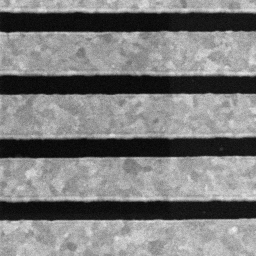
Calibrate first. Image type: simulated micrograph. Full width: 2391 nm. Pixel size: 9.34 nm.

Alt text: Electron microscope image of lines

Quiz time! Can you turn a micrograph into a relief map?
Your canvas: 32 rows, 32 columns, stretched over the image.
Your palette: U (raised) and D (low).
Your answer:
UUUUUUUUUUUUUUUUUUUUUUUUUUUUUUUU
DDDDDDDDDDDUDDDDDDUUDDDDDDUDDDDU
DDDDDDDDDDDDDDDDDDDDDDDDDDDDDDDD
DDDDDDDDDDDDDDDDDDDDDDDDDDDDDDDD
UUUUUUUUUUUUUUUUUUUUUUUUUUUUUUUU
UUUUUUUUUUUUUUUUUUUUUUUUUUUUUUUU
UUUUUUUUUUUUUUUUUUUUUUUUUUUUUUUU
UUUUUUUUUUUUUUUUUUUUUUUUUUUUUUUU
UUUUUUUUUUUUUUUUUUUUUUUUUUUUUUUU
DDDDDDDDDDDDDDDDDDDDDDDDDDDDDDDD
DDDDDDDDDDDDDDDDDDDDDDDDDDDDDDDD
DDDDDDDDDDDDDDDDDDDDDDDDDDDDDDDD
UUUUUUUUUUUUUUUUUUUUUUUUUUUUUUUU
UUUUUUUUUUUUUUUUUUUUUUUUUUUUUUUU
UUUUUUUUUUUUUUUUUUUUUUUUUUUUUUUU
UUUUUUUUUUUUUUUUUUUUUUUUUUUUUUUU
UUUUUUUUUUUUUUUUUUUUUUUUUUUUUUUU
DDDDDDDDDDDDDDDDDDDDDDDDDDDDDDDD
DDDDDDDDDDDDDDDDDDDDDDDDDDDDDDDD
DDDDDDDDDDDDDDDDDDDDDDDDDDDDDDDD
UUUUUUUUUUUUUUUUUUUUUUUUUUUUUUUU
UUUUUUUUUUUUUUUUUUUUUUUUUUUUUUUU
UUUUUUUUUUUUUUUUUUUUUUUUUUUUUUUU
UUUUUUUUUUUUUUUUUUUUUUUUUUUUUUUU
UUUUUUUUUUUUUUUUUUUUUUUUUUUUUUUU
DDDDDDDDDDDDDDDDDDDDDDDDDDDDDDDD
DDDDDDDDDDDDDDDDDDDDDDDDDDDDDDDD
DDDDDDDDDDDDDDDDDDDUUDDUUUUUUUUU
UUUUUUUUUUUUUUUUUUUUUUUUUUUUUUUU
UUUUUUUUUUUUUUUUUUUUUUUUUUUUUUUU
UUUUUUUUUUUUUUUUUUUUUUUUUUUUUUUU
UUUUUUUUUUUUUUUUUUUUUUUUUUUUUUUU